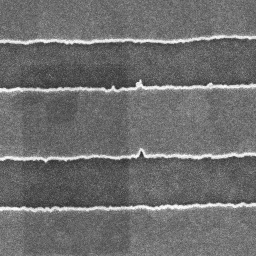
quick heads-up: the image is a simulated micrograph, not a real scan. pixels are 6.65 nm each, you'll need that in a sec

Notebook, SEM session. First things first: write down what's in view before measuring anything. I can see one or a few lines or trenches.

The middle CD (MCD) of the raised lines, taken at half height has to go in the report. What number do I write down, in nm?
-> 463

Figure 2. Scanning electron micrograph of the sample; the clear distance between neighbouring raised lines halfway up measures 320 nm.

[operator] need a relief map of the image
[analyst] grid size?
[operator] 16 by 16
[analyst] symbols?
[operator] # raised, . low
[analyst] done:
################
################
############....
................
................
........########
################
################
################
################
................
................
................
################
################
################